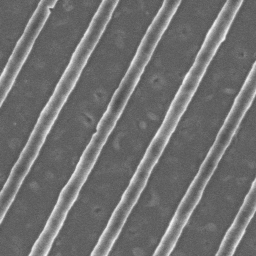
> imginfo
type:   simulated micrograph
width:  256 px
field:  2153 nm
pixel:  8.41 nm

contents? parallel lines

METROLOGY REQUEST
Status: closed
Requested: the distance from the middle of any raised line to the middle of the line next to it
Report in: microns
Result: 0.462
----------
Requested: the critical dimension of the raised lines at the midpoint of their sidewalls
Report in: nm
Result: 125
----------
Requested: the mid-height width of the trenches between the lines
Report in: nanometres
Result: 336